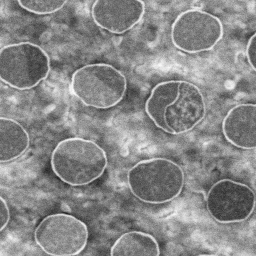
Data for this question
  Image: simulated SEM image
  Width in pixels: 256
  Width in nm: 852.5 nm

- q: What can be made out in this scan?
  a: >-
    raised bodies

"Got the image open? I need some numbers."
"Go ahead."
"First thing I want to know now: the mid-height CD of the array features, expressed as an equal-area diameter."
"158 nm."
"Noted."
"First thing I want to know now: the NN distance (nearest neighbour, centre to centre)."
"77.2 pixels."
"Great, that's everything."